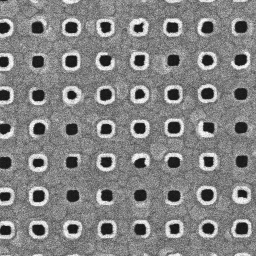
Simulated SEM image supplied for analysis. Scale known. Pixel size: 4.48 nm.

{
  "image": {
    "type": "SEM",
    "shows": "a regular array of holes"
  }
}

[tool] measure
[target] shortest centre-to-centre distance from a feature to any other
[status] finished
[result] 148 nm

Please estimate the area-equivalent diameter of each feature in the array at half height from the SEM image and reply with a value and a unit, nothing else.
0.0553 microns